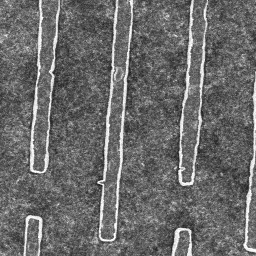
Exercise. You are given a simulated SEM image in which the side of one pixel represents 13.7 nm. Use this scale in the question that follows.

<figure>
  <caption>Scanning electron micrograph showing one or a few lines or trenches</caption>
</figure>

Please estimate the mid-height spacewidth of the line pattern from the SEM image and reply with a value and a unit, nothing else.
796 nm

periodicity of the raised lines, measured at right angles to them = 1020 nanometers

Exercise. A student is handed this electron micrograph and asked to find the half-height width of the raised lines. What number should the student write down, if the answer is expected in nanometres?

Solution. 218